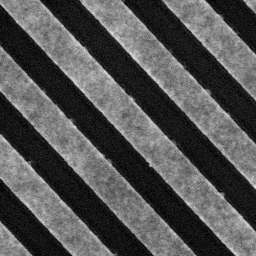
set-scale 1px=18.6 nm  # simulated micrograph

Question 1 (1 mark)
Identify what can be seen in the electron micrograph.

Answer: lines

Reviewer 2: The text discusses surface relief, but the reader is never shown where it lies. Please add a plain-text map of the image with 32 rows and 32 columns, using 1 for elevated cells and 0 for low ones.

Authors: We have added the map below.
11111000001111110000011111000001
01111100000111110000001111100000
00111110000011111000000111110000
00011111000001111100000111111000
00001111100000111110000011111100
00000111110000011111000001111110
10000011111000001111100000111111
11000001111100000111110000011111
11100000111110000011111000001111
11110000111111000001111100000111
11110000011111100000111110000011
11111000001111110000011111000001
01111100000111111000001111100000
00111110000011111000000111110000
00011111000001111100000111111000
00001111100000111110000011111000
00000111110000011111000001111110
10000011111000001111100000111110
11000001111100000111110000011111
11100000111110000011111000001111
11110000011111000001111100000111
11110000001111100000111110000011
11111000001111110000011111000001
01111100000111111000001111100000
00111110000011111100001111110000
00011111000001111100000111111000
00001111100000111110000011111100
00000111110000011111000001111110
10000011111000001111100000111111
11000001111100000111110000011111
11100000111110000011111000001111
11110000011111000001111100000111